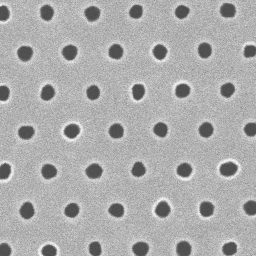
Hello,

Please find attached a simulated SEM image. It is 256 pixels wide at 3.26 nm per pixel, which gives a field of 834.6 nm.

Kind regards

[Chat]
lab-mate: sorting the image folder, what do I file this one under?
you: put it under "a regular array of holes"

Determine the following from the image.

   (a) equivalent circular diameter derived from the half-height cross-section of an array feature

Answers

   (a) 0.0464 µm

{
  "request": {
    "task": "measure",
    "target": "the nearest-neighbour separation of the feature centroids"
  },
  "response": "145 nm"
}